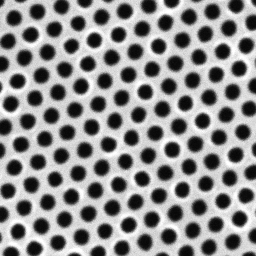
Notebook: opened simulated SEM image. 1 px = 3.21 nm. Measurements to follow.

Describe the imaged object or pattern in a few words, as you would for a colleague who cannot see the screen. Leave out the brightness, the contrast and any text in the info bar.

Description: a regular array of holes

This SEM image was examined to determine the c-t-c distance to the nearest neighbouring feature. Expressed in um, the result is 0.0763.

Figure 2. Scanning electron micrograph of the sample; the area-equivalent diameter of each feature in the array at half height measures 0.0536 µm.